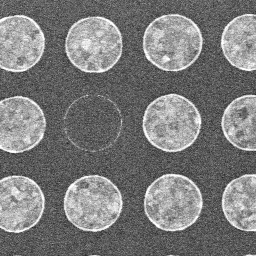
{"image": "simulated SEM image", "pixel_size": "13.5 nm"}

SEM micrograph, raised bodies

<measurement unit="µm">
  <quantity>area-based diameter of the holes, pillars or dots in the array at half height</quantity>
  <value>0.758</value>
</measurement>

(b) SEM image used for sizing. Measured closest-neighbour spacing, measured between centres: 1080 nanometers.